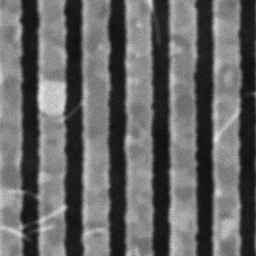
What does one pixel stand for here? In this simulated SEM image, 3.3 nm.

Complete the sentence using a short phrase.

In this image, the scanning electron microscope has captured lines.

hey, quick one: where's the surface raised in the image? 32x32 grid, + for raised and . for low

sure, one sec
+++..+++..++++..+++..+++...+++..
+++..+++..++++..+++..++++..+++..
++...+++..++++..+++..++++..+++..
+++..+++..+++...+++..++++..+++..
+++..+++..+++...+++..++++..+++..
+++..+++..++++..+++..+++...+++..
+++..+++..++++..+++..++++..+++..
++...+++..+++...+++..++++..+++..
+++..+++..+++...+++..+++...+++..
+++..+++..++++..+++..+++...+++..
+++..+++..++++..+++..+++...+++..
+++..+++..++++..+++..+++...+++..
+++..+++..+++...+++..+++...+++..
+++..+++..++++..+++..+++...+++..
+++..+++..++++..+++..+++...+++..
+++..+++..++++..+++..++++..+++..
+++..+++..++++..+++..+++...+++..
+++..+++..+++...+++..+++...+++..
+++..+++..+++...+++..++++..+++..
+++..+++..++++..+++..+++...+++..
++...+++..++++..+++..++++..+++..
++...+++..++++..+++..++++..+++..
+++..+++..+++...+++..++++..+++..
+++..+++..++++..+++..++++..+++..
+++..+++..++++..+++..+++...+++..
+++..+++..++++..+++..++++..+++..
+++..+++..++++..+++..++++..+++..
+++..+++..++++..+++..++++..+++..
+++..+++..++++..+++..++++..+++..
+++..+++..++++..+++..+++...+++..
+++..+++..++++..+++..++++..+++..
+++..+++..++++..+++..+++...+++..